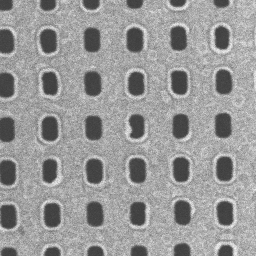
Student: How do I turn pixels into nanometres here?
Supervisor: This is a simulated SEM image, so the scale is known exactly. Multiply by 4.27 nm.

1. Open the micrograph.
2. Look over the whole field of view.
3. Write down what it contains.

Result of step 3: a regular array of holes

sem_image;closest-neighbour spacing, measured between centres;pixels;42.9